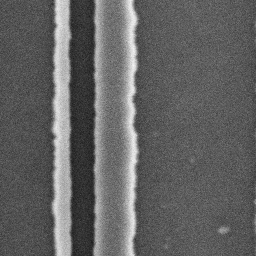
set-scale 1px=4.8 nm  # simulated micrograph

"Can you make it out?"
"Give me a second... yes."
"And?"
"lines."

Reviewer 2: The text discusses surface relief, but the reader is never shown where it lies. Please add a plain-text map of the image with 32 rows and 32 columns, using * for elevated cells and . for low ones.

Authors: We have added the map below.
.......**...****................
.......**...****................
.......**...*****...............
.......**...****................
.......**...****................
.......**...****................
.......**...*****...............
.......**...*****...............
.......**...*****...............
.......**...****................
.......**...*****...............
.......**...*****...............
.......**...****................
.......**...*****...............
.......**...****................
.......**...****................
.......**...*****...............
.......**...*****...............
.......**...*****...............
.......**...*****...............
.......**...*****...............
.......**...****................
.......**...*****...............
.......**...****................
.......**...*****...............
.......**...****................
.......**...****................
.......**...*****...............
.......**...*****...............
.......**...*****...............
.......**...****................
.......**...****................